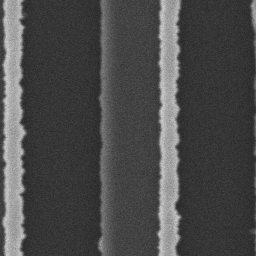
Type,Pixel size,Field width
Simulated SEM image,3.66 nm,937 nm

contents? lines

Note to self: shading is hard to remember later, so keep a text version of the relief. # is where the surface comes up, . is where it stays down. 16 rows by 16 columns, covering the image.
#.....#####.....
#.....#####.....
#.....#####.....
#.....#####.....
#.....#####.....
#.....#####.....
#.....#####.....
#.....#####.....
#.....#####.....
#.....#####.....
#.....#####.....
#.....#####.....
#.....#####.....
#.....#####.....
#.....#####.....
#.....#####.....